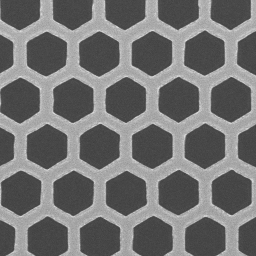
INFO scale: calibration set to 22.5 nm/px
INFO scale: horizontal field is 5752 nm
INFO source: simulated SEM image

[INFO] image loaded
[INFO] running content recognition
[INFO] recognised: a regular array of holes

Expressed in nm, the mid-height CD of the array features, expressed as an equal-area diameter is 955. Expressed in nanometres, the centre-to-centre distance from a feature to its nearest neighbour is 1180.